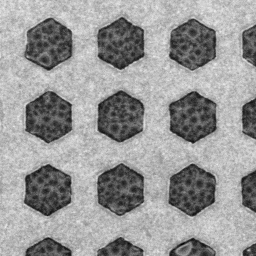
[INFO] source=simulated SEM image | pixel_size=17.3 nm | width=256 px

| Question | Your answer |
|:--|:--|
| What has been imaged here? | a regular array of holes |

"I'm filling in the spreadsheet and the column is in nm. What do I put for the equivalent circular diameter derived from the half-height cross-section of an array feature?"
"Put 838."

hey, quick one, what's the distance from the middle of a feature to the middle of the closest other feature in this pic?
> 71.8 pixels